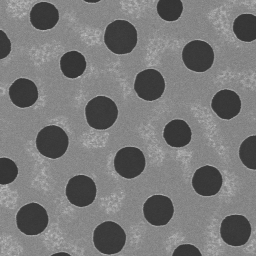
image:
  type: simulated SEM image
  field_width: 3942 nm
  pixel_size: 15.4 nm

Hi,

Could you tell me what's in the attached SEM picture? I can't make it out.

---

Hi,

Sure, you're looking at a regular array of holes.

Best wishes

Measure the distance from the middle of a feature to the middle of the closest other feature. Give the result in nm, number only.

860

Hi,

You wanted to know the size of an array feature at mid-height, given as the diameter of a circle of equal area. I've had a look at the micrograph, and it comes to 487 nm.